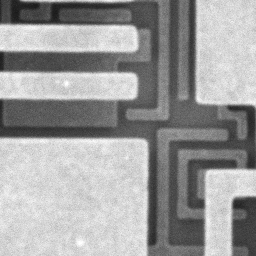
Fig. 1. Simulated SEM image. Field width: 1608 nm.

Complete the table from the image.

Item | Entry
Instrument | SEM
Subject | wiring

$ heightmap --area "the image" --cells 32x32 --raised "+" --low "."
.........................+++++++
.........................+++++++
.........................+++++++
+++++++++++++++++........+++++++
+++++++++++++++++........+++++++
+++++++++++++++++........+++++++
.........................+++++++
.........................+++++++
.........................+++++++
+++++++++++++++++........+++++++
+++++++++++++++++........+++++++
+++++++++++++++++........+++++++
.........................+++++++
................................
................................
................................
................................
++++++++++++++++++..............
++++++++++++++++++..............
++++++++++++++++++..............
++++++++++++++++++..............
++++++++++++++++++........++++++
++++++++++++++++++........++++++
++++++++++++++++++........++++++
++++++++++++++++++........++++..
++++++++++++++++++........+++...
++++++++++++++++++........+++...
++++++++++++++++++........+++...
++++++++++++++++++........+++...
++++++++++++++++++........+++...
++++++++++++++++++........+++...
++++++++++++++++++........+++...